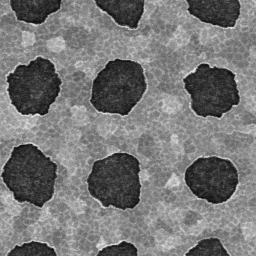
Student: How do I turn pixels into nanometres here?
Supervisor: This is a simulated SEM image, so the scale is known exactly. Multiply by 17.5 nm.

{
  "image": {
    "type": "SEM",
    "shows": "holes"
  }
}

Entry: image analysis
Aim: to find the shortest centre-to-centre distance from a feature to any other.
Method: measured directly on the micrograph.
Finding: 1500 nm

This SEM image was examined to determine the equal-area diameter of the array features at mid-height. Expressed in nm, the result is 973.